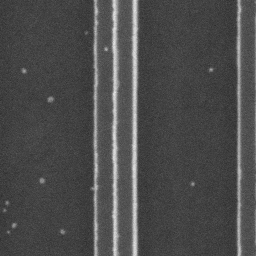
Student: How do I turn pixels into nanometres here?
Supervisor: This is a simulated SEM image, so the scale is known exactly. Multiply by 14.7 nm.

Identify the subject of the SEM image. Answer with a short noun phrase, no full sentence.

lines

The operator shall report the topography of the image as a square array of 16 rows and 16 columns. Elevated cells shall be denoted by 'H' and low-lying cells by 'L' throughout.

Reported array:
LLLLLLHHLLLLLLLH
LLLLLLHHLLLLLLLH
LLLLLLHHLLLLLLLH
LLLLLLHHLLLLLLLH
LLLLLLHHLLLLLLLH
LLLLLLHHLLLLLLLH
LLLLLLHHLLLLLLLH
LLLLLLHHLLLLLLLH
LLLLLLHHLLLLLLLH
LLLLLLHHLLLLLLLH
LLLLLLHHLLLLLLLH
LLLLLLHHLLLLLLLH
LLLLLLHHLLLLLLLH
LLLLLLHHLLLLLLLH
LLLLLLHHLLLLLLLH
LLLLLLHHLLLLLLLH